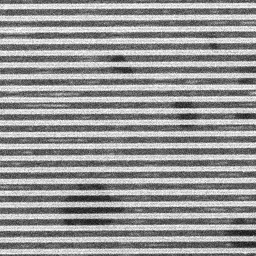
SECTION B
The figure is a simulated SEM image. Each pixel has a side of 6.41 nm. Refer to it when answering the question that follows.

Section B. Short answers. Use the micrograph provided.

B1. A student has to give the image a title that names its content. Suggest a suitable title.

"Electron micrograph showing parallel lines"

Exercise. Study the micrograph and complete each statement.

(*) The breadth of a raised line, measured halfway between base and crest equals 28.8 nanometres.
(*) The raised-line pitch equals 0.0748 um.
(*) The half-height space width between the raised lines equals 47.3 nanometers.